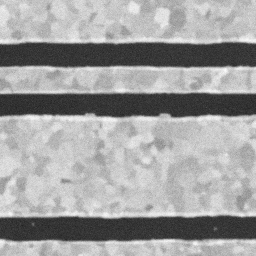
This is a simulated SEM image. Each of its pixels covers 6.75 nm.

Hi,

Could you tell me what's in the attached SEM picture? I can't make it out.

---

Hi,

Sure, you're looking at lines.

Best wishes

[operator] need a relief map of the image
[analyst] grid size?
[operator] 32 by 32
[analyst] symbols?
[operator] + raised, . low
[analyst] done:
++++++++++++++++++++++++++++++++
++++++++++++++++++++++++++++++++
++++++++++++++++++++++++++++++++
++++++++++++++++++++++++++++++++
++++++++++++++++++++++++++++++++
................................
................................
................................
+++++++...++++++++++........++++
++++++++++++++++++++++++++++++++
++++++++++++++++++++++++++++++++
++++++++++++++++++++++++++++++++
................................
................................
...+............................
++++++++++++++++++++++++++++++++
++++++++++++++++++++++++++++++++
++++++++++++++++++++++++++++++++
++++++++++++++++++++++++++++++++
++++++++++++++++++++++++++++++++
++++++++++++++++++++++++++++++++
++++++++++++++++++++++++++++++++
++++++++++++++++++++++++++++++++
++++++++++++++++++++++++++++++++
++++++++++++++++++++++++++++++++
++++++++++++++++++++++++++++++++
++++++++++++++++++++++++++++++++
................................
................................
................................
++++++++++++++++++++++++++++++++
++++++++++++++++++++++++++++++++